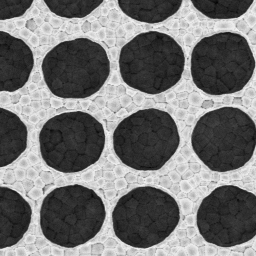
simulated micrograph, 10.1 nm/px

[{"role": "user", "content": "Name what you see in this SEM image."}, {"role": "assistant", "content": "holes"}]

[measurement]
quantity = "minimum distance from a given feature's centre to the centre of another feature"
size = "741 nm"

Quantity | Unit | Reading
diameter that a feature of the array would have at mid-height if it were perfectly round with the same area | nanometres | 651